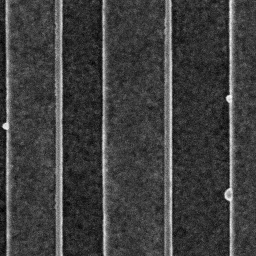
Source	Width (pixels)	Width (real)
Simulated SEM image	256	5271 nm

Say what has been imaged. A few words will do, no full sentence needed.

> lines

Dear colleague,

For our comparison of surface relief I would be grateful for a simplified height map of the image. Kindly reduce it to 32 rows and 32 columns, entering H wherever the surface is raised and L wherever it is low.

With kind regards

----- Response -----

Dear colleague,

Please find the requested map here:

LHHHHHHHLLLLLHHHHHHHHLLLLLLLLHHH
LHHHHHHHLLLLLHHHHHHHHLLLLLLLLHHH
LHHHHHHHLLLLLHHHHHHHHLLLLLLLLHHH
LHHHHHHHLLLLLHHHHHHHHLLLLLLLLHHH
LHHHHHHHLLLLLHHHHHHHHLLLLLLLLHHH
LHHHHHHHLLLLLHHHHHHHHLLLLLLLLHHH
LHHHHHHHLLLLLHHHHHHHHLLLLLLLLHHH
LHHHHHHHLLLLLHHHHHHHHLLLLLLLLHHH
LHHHHHHHLLLLLHHHHHHHHLLLLLLLLHHH
LHHHHHHHLLLLLHHHHHHHHLLLLLLLLHHH
LHHHHHHHLLLLLHHHHHHHHLLLLLLLLHHH
LHHHHHHHLLLLLHHHHHHHHLLLLLLLLHHH
LHHHHHHHLLLLLHHHHHHHHLLLLLLLHHHH
LHHHHHHHLLLLLHHHHHHHHLLLLLLLLHHH
LHHHHHHHLLLLLHHHHHHHHLLLLLLLLHHH
LHHHHHHHLLLLLHHHHHHHHLLLLLLLLHHH
LHHHHHHHLLLLLHHHHHHHHLLLLLLLLHHH
LHHHHHHHLLLLLHHHHHHHHLLLLLLLLHHH
LHHHHHHHLLLLLHHHHHHHHLLLLLLLLHHH
LHHHHHHHLLLLLHHHHHHHHLLLLLLLLHHH
LHHHHHHHLLLLLHHHHHHHHLLLLLLLLHHH
LHHHHHHHLLLLLHHHHHHHHLLLLLLLLHHH
LHHHHHHHLLLLLHHHHHHHHLLLLLLLLHHH
LHHHHHHHLLLLLHHHHHHHHLLLLLLLLHHH
LHHHHHHHLLLLLHHHHHHHHLLLLLLLHHHH
LHHHHHHHLLLLLHHHHHHHHLLLLLLLLHHH
LHHHHHHHLLLLLHHHHHHHHLLLLLLLLHHH
LHHHHHHHLLLLLHHHHHHHHLLLLLLLLHHH
LHHHHHHHLLLLLHHHHHHHHLLLLLLLLHHH
LHHHHHHHLLLLLHHHHHHHHLLLLLLLLHHH
LHHHHHHHLLLLLHHHHHHHHLLLLLLLLHHH
LHHHHHHHLLLLLHHHHHHHHLLLLLLLLHHH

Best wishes